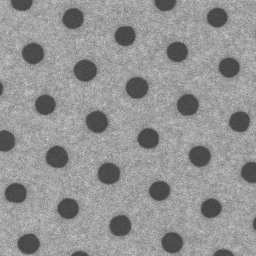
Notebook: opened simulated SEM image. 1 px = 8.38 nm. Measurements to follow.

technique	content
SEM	a regular array of holes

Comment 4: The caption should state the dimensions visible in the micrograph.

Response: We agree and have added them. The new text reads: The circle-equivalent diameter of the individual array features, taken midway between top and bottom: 179 nm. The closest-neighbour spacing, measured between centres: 440 nm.